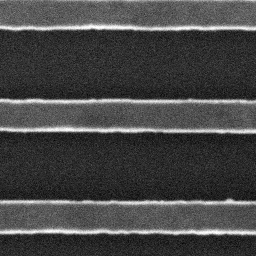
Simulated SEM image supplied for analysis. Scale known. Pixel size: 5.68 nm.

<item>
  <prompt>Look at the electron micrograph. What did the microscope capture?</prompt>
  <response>lines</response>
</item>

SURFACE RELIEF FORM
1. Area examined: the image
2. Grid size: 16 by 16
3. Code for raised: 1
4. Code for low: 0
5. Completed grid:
1111111111111111
1111111111111111
0000000000000000
0000000000000000
0000000000000000
0000000000000000
1111111111111111
1111111111111111
0000000000000000
0000000000000000
0000000000000000
0000000000000000
0000000000000000
1111111111111111
1111111111111111
0000000000000000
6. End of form